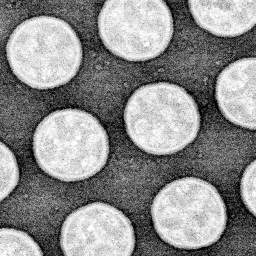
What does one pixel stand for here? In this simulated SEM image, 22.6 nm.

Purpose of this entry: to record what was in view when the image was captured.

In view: raised bodies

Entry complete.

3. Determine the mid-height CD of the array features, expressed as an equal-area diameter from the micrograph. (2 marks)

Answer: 1590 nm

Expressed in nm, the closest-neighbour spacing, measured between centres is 2160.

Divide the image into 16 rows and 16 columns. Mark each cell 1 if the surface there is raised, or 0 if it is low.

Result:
0000000111001111
0011001111100111
0111100111000000
0111100010000000
0111100000000011
0000000001100011
0000000011110011
0001110011110001
0011111011110000
1011111000000000
1001110000000000
1000000000011001
0000000000111101
0000011100111100
1000111100111100
1100111100000000